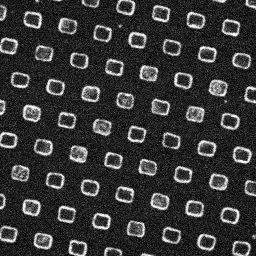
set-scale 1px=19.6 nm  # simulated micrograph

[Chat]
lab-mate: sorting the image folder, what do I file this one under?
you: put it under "a regular array of raised bodies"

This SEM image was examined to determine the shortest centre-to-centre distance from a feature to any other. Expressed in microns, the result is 0.689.